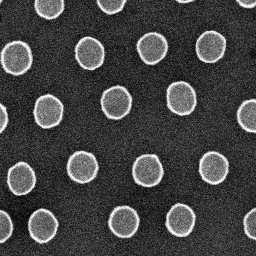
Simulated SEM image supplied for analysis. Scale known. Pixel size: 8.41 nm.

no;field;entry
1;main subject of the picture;a regular array of raised bodies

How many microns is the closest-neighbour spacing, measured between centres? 0.482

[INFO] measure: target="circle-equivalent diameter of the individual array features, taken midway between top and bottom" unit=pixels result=30.5